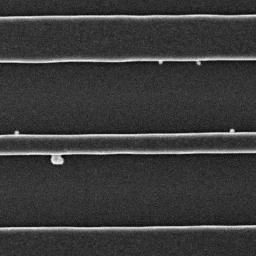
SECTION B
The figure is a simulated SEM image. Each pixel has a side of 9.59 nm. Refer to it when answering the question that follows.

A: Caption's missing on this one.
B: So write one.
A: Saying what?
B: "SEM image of wiring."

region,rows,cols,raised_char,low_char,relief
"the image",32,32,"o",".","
................................
................................
oooooooooooooooooooooooooooooooo
oooooooooooooooooooooooooooooooo
oooooooooooooooooooooooooooooooo
oooooooooooooooooooooooooooooooo
oooooooooooooooooooooooooooooooo
ooooooooooooooooooooooooo.......
................................
................................
................................
................................
................................
................................
................................
................................
................................
oooooooooooooooooooooooooooooooo
oooooooooooooooooooooooooooooooo
................................
................................
................................
................................
................................
................................
................................
................................
................................
....oooooo..oooooooooooooooooooo
oooooooooooooooooooooooooooooooo
oooooooooooooooooooooooooooooooo
oooooooooooooooooooooooooooooooo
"